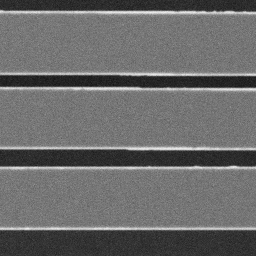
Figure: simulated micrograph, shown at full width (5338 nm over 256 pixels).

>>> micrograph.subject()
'lines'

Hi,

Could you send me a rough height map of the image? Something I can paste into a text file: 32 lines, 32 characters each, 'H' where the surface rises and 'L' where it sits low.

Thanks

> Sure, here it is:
LLLLLLLLLLLLLLLLLLLLLLLLLLLLLLLL
HHHHHHHHHHHHHHHHHHHHHHLHHHLLHLLL
HHHHHHHHHHHHHHHHHHHHHHHHHHHHHHHH
HHHHHHHHHHHHHHHHHHHHHHHHHHHHHHHH
HHHHHHHHHHHHHHHHHHHHHHHHHHHHHHHH
HHHHHHHHHHHHHHHHHHHHHHHHHHHHHHHH
HHHHHHHHHHHHHHHHHHHHHHHHHHHHHHHH
HHHHHHHHHHHHHHHHHHHHHHHHHHHHHHHH
HHHHHHHHHHHHHHHHHHHHHHHHHHHHHHHH
LLLLLLLLLLLLLLLLLLLLLLLLLLLLLLLL
LLLLLLLLLLLLLLLLLLLLLLLLLLLLLLLL
HHHHHHHHHHHHHHHHHHHHHHHHHHHHHHHH
HHHHHHHHHHHHHHHHHHHHHHHHHHHHHHHH
HHHHHHHHHHHHHHHHHHHHHHHHHHHHHHHH
HHHHHHHHHHHHHHHHHHHHHHHHHHHHHHHH
HHHHHHHHHHHHHHHHHHHHHHHHHHHHHHHH
HHHHHHHHHHHHHHHHHHHHHHHHHHHHHHHH
HHHHHHHHHHHHHHHHHHHHHHHHHHHHHHHH
HHHHHHHHHHHHHHHHHHHHHHHHHHHHHHHH
LLLLLLLLLLLLLLLLLLLLLLLLLLLLLLLL
LLLLLLLLLLLLLLLLLLLLLLLLLLLLLLLL
HHHHHHHHHHHHHHHHHHHHHHHHHHHHHHHH
HHHHHHHHHHHHHHHHHHHHHHHHHHHHHHHH
HHHHHHHHHHHHHHHHHHHHHHHHHHHHHHHH
HHHHHHHHHHHHHHHHHHHHHHHHHHHHHHHH
HHHHHHHHHHHHHHHHHHHHHHHHHHHHHHHH
HHHHHHHHHHHHHHHHHHHHHHHHHHHHHHHH
HHHHHHHHHHHHHHHHHHHHHHHHHHHHHHHH
HHHHHHHHHHHHHHHHHHHHHHHHHHHHHHHH
LLLLLLLLLLLLLLLLLLLLLLLLLLLLLLLL
LLLLLLLLLLLLLLLLLLLLLLLLLLLLLLLL
LLLLLLLLLLLLLLLLLLLLLLLLLLLLLLLL